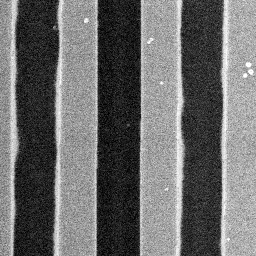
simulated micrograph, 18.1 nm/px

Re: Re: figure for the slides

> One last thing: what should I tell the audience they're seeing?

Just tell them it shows lines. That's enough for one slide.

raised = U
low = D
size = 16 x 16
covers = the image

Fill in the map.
UDDDUUDDDUUDDDUU
UDDDUUDDDUUDDDUU
UDDDUUDDDUUDDDUU
UDDDUUDDDUUDDDUU
UDDDUUDDDUUDDDUU
UDDDUUDDDUUDDDUU
UDDDUUDDDUUDDDUU
UDDDUUDDDUUDDDUU
UDDDUUDDDUUDDDUU
UDDDUUDDDUUDDDUU
UDDDUUDDDUUDDDUU
UDDDUUDDDUUDDDUU
UDDDUUDDDUUDDDUU
UDDDUUDDDUUDDDUU
UDDDUUDDDUUDDDUU
UDDDUUDDDUUDDDUU